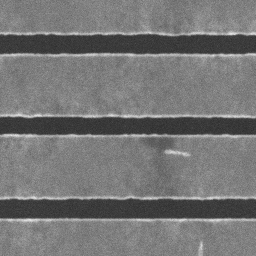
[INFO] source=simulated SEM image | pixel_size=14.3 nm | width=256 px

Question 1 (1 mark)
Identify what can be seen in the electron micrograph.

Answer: lines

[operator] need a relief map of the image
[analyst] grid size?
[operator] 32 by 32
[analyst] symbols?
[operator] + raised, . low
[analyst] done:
++++++++++++++++++++++++++++++++
++++++++++++++++++++++++++++++++
++++++++++++++++++++++++++++++++
++++++++++++++++++++++++++++++++
................................
................................
................................
++++++++++++++++++++++++++++++++
++++++++++++++++++++++++++++++++
++++++++++++++++++++++++++++++++
++++++++++++++++++++++++++++++++
++++++++++++++++++++++++++++++++
++++++++++++++++++++++++++++++++
++++++++++++++++++++++++++++++++
++++++++++++++++++++++++++++++++
................................
................................
++++++++++++++++++++++++++++++++
++++++++++++++++++++++++++++++++
++++++++++++++++++++++++++++++++
++++++++++++++++++++++++++++++++
++++++++++++++++++++++++++++++++
++++++++++++++++++++++++++++++++
++++++++++++++++++++++++++++++++
++++++++++++++++++++++++++++++++
................................
................................
++++++++++++++++++++++++++++++++
++++++++++++++++++++++++++++++++
++++++++++++++++++++++++++++++++
++++++++++++++++++++++++++++++++
++++++++++++++++++++++++++++++++